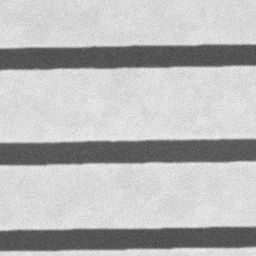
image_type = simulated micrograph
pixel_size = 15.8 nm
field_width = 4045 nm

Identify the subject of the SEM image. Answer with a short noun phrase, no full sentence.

lines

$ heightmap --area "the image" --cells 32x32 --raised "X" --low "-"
XXXXXXXXXXXXXXXXXXXXXXXXXXXXXXXX
XXXXXXXXXXXXXXXXXXXXXXXXXXXXXXXX
XXXXXXXXXXXXXXXXXXXXXXXXXXXXXXXX
XXXXXXXXXXXXXXXXXXXXXXXXXXXXXXXX
XXXXXXXXXXXXXXXXXXXXXXXXXXXXXXXX
XXXXXXXXXXXXXXXXXXXXXXXXX-------
--------------------------------
--------------------------------
---------------------XXXXXXXXXXX
XXXXXXXXXXXXXXXXXXXXXXXXXXXXXXXX
XXXXXXXXXXXXXXXXXXXXXXXXXXXXXXXX
XXXXXXXXXXXXXXXXXXXXXXXXXXXXXXXX
XXXXXXXXXXXXXXXXXXXXXXXXXXXXXXXX
XXXXXXXXXXXXXXXXXXXXXXXXXXXXXXXX
XXXXXXXXXXXXXXXXXXXXXXXXXXXXXXXX
XXXXXXXXXXXXXXXXXXXXXXXXXXXXXXXX
XXXXXXXXXXXXXXXXXXXXXXXXXXXXXXXX
XXXXXXXXXXXXXXXXXX--------------
--------------------------------
--------------------------------
------------------XXXXXXXXXXXXXX
XXXXXXXXXXXXXXXXXXXXXXXXXXXXXXXX
XXXXXXXXXXXXXXXXXXXXXXXXXXXXXXXX
XXXXXXXXXXXXXXXXXXXXXXXXXXXXXXXX
XXXXXXXXXXXXXXXXXXXXXXXXXXXXXXXX
XXXXXXXXXXXXXXXXXXXXXXXXXXXXXXXX
XXXXXXXXXXXXXXXXXXXXXXXXXXXXXXXX
XXXXXXXXXXXXXXXXXXXXXXXXXXXXXXXX
XXXXXXXXX-----------------------
--------------------------------
--------------------------------
XXXXXXXXXXXXXXXXXXXXXXXXXXXXXXXX